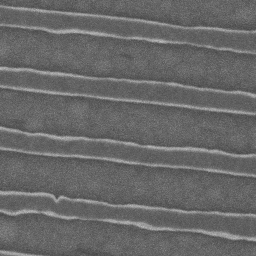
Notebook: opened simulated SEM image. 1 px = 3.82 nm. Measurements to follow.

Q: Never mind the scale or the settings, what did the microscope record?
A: one or a few lines or trenches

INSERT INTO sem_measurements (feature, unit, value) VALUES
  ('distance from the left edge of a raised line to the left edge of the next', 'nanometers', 235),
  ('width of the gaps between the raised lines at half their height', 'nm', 162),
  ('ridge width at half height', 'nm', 73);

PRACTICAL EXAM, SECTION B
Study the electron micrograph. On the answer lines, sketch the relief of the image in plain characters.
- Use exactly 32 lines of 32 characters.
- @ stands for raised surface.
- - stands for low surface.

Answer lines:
--------------------------------
@@@@@@@-------------------------
@@@@@@@@@@@@@@@@@---------------
---@@@@@@@@@@@@@@@@@@@@@@-------
--------------@@@@@@@@@@@@@@@@@@
------------------------@@@@@@@@
------------------------------@@
--------------------------------
--------------------------------
@@@@@@@@@@----------------------
@@@@@@@@@@@@@@@@@@@@@@----------
------@@@@@@@@@@@@@@@@@@@@@@@@--
----------------@@@@@@@@@@@@@@@@
-------------------------@@@@@@@
--------------------------------
--------------------------------
@@@-----------------------------
@@@@@@@@@@@@--------------------
@@@@@@@@@@@@@@@@@@@@------------
--------@-@@@@@@@@@@@@@@@@@@@@@@
-----------------@@@@@@@@@@@@@@@
----------------------------@@@@
--------------------------------
--------------------------------
@@@@@@--------------------------
@@@@@@@@@@@@@-------------------
-@@--@@@@@@@@@@@@@@@@@@-@-------
-----------@@@@@@@@@@@@@@@@@@@@@
-------------------@@@@@@@@@@@@@
----------------------------@@@@
--------------------------------
--------------------------------